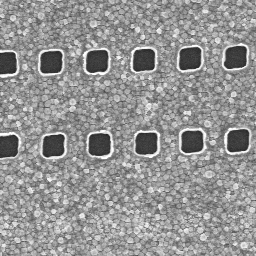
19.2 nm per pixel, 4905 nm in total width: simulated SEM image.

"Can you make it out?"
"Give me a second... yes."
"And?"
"a regular array of holes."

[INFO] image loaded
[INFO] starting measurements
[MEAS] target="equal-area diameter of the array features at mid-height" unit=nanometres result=478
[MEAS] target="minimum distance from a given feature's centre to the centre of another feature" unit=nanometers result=881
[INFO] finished